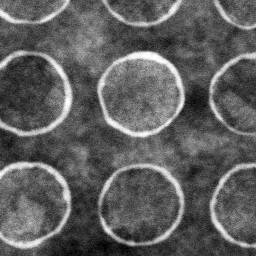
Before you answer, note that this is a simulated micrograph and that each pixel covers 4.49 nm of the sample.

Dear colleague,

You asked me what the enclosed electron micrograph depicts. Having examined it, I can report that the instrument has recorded raised bodies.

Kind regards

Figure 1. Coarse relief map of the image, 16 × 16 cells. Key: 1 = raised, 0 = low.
1111000111100011
0000000010000001
0000000000000000
0110000011000001
1111000111100011
1111001111100111
1111001111100111
1111000111100011
0000000000000000
0000000000000000
1110000011000001
1111000111100011
1111001111100111
1111001111100111
1110000111100011
0000000000000000